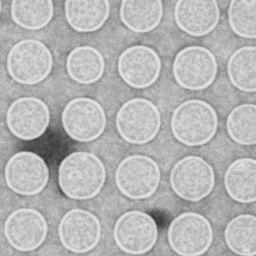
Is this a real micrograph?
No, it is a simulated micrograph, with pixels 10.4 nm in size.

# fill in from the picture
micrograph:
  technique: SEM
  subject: a regular array of raised bodies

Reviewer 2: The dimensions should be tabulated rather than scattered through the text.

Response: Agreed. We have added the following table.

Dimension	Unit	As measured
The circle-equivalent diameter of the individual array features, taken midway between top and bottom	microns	0.427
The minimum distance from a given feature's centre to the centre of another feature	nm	567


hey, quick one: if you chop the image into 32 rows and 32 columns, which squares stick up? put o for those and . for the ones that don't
..oooo..ooooo..ooooo..ooooo..ooo
..oooo..ooooo..ooooo..ooooo..ooo
..oooo...oooo..ooooo..ooooo..ooo
.........ooo....ooo....ooo...ooo
...............................o
..ooo...........................
.ooooo...ooo....ooo....ooo....oo
.ooooo...oooo..ooooo..ooooo..ooo
.ooooo...oooo..ooooo..ooooo..ooo
..oooo...ooo...ooooo..ooooo..ooo
................ooo....ooo...ooo
................................
...o......o.....................
.ooooo..oooo...oooo...oooo....oo
.ooooo..ooooo..ooooo..ooooo..ooo
.ooooo..ooooo..ooooo..ooooo..ooo
..ooo....oooo..oooo...ooooo..ooo
..........o.....oo.....ooo....oo
................................
..oo.....oo.....................
.ooooo..ooooo..oooo...oooo...ooo
.ooooo..ooooo..ooooo..oooo..oooo
.ooooo..ooooo..ooooo.oooooo.oooo
..ooo...oooo...oooo...oooo..oooo
.........oo.....oo.....oo....ooo
................................
..oo.....oo.....................
.oooo...oooo...oooo...oooo...ooo
.ooooo..oooo...oooo..ooooo..oooo
.oooo...oooo...oooo..ooooo..oooo
..ooo...oooo...oooo..ooooo...ooo
......................ooo.....oo